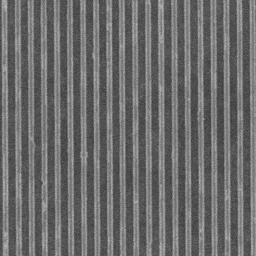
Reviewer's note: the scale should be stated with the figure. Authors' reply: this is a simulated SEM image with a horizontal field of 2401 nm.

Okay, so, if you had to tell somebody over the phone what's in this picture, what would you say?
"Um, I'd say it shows parallel lines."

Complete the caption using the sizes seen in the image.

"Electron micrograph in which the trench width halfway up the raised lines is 0.0798 µm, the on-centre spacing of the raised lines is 122 nm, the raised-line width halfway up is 39.9 nanometres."